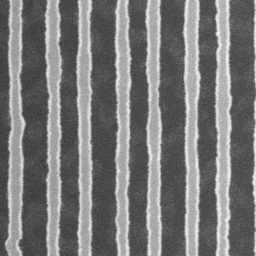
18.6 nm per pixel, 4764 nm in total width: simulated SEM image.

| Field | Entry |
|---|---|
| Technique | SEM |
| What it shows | parallel lines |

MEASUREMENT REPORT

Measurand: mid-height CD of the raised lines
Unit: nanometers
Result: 193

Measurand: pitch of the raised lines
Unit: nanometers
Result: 644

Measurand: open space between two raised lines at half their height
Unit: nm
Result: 482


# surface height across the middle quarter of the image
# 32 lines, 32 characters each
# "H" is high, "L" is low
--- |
LLLLHHHLLLLLLHHHLLLLLHHLLLLLLLLH
LLLHHHHLLLLLLLHHLLLLLHHHLLLLLLLH
LLLLHHLLLLLLLLHHLLLLLHHHLLLLLLLH
LLLLHHLLLLLLLLHHLLLLLHHHLLLLLLHH
LLLLHHLLLLLLLLHHLLLLLHHHLLLLLLHH
LLLLHHLLLLLLLHHHLLLLLHHLLLLLLLLH
LLLLHHHLLLLLLHHHLLLLLHHLLLLLLLLH
LLLLHHHLLLLLLLHHLLLLLLHLLLLLLLLH
LLLLHHHLLLLLLLHHLLLLLLHLLLLLLLLH
LLLLHHLLLLLLLLHHLLLLLHHLLLLLLLLH
LLLLHHLLLLLLLLHHLLLLLHHHLLLLLLLH
LLLLHHLLLLLLLLHHLLLLLHHHLLLLLLLH
LLLLHHLLLLLLLLHHLLLLLHHHLLLLLLLH
LLLLHHLLLLLLLLHHLLLLLHHHLLLLLLLH
LLLLHHLLLLLLLLHHLLLLLHHHLLLLLLLH
LLLLHHLLLLLLLLHHLLLLLHHHLLLLLLLH
LLLLHHLLLLLLLLHHLLLLLHHHLLLLLLLH
LLLLHHLLLLLLLLHHLLLLLHHHLLLLLLLH
LLLLHHLLLLLLLLHHLLLLLHHHLLLLLLLH
LLLLHHLLLLLLLLHHLLLLLHHHLLLLLLLH
LLLLHHHLLLLLLLHHLLLLLHHHLLLLLLLH
LLLLHHHLLLLLLLHHLLLLLHHHLLLLLLLH
LLLLHHHLLLLLLHHHLLLLLHHHLLLLLLLH
LLLLHHHLLLLLLHHHLLLLLLHHLLLLLLLH
LLLLHHHLLLLLLHHHLLLLLHHHLLLLLLLH
LLLLHHHLLLLLLHHHLLLLLHHHLLLLLLLH
LLLLHHHLLLLLLLHHLLLLLHHHLLLLLLLH
LLLLHHHLLLLLLHHHLLLLLHHHLLLLLLLH
LLLLHHHLLLLLLHHHLLLLLHHHLLLLLLLH
LLLLHHHLLLLLLHHHLLLLLHHHLLLLLLLH
LLLLHHHLLLLLLHHHLLLLLHHHLLLLLLLH
LLLLHHHLLLLLLHHLLLLLLHHHLLLLLLLH